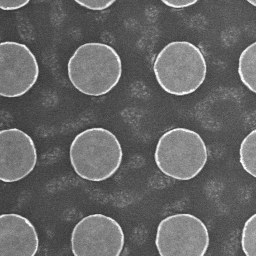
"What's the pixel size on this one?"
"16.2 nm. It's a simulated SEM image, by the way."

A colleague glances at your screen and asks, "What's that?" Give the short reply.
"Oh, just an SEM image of raised bodies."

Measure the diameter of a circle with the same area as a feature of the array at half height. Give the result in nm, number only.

840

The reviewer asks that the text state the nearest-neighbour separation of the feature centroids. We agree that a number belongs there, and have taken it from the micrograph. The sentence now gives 1.38 microns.